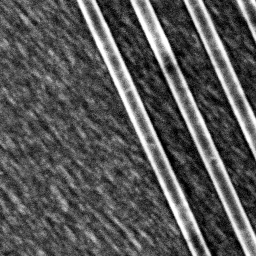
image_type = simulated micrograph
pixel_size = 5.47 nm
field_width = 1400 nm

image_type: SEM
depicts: parallel lines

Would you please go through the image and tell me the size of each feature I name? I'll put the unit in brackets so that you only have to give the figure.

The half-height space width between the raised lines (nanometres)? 189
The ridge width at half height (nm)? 75.4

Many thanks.